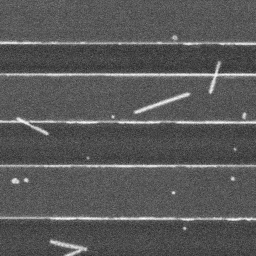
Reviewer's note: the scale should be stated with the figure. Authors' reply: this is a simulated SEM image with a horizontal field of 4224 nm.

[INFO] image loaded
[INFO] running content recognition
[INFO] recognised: lines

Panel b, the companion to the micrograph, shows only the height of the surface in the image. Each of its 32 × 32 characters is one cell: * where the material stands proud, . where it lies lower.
********************************
********************************
********************************
********************************
********************************
................................
................................
................................
................................
********************************
********************************
********************************
********************************
********************************
********************************
................................
................................
................................
................................
................................
................................
********************************
********************************
********************************
********************************
********************************
********************************
................................
................................
................................
................................
................................